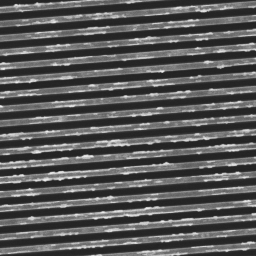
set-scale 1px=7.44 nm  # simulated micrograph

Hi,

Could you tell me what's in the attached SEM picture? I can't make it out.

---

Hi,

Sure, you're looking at parallel lines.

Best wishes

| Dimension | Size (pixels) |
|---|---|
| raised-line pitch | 14.2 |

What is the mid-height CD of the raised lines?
7.59 pixels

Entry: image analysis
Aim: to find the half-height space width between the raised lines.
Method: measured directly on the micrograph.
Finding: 50.9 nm